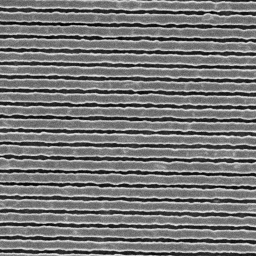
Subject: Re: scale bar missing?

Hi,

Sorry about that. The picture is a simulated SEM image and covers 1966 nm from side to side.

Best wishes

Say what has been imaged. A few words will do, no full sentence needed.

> parallel lines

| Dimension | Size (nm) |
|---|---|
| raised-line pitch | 103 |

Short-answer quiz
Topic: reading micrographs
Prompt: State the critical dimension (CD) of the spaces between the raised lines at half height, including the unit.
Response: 28.8 nm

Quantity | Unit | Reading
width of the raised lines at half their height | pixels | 9.49